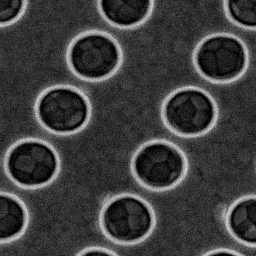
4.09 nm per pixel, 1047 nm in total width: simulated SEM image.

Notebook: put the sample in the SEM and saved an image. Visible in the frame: holes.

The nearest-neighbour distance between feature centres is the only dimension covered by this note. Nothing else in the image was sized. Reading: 61.9 px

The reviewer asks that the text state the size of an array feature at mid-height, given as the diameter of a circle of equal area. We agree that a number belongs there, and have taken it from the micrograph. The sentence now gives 197 nm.